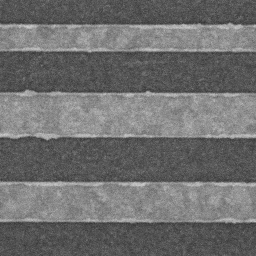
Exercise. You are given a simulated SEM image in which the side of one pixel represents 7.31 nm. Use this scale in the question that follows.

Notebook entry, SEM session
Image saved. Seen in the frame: one or a few lines or trenches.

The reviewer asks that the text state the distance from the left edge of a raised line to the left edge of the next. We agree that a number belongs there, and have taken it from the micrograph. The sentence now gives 600 nanometres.